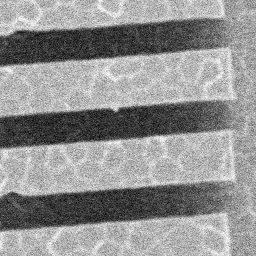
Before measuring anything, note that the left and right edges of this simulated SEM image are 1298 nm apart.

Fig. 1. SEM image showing one or a few lines or trenches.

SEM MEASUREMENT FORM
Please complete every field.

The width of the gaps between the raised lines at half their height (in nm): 163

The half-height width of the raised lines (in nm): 249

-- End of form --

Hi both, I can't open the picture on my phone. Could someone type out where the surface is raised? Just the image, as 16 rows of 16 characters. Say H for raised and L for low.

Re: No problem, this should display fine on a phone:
HHHHHHHHHHHHHHLL
HHHHHHHHLLLLLLLL
LLLLLLLLLLLLLLLL
LLLLLLLLHHHHHHLL
HHHHHHHHHHHHHHLL
HHHHHHHHHHHHHHLL
HHHHHHHHHHLLLLLL
LLLLLLLLLLLLLLLL
LLLLLLLLLLHHHHLL
HHHHHHHHHHHHHHHL
HHHHHHHHHHHHHHHL
HHHHHHHHHHHLLLLL
LLLLLLLLLLLLLLLL
LLLLLLLLLLLLHHLL
HHHHHHHHHHHHHHLL
HHHHHHHHHHHHHHLL